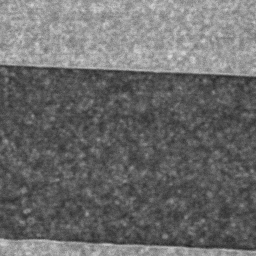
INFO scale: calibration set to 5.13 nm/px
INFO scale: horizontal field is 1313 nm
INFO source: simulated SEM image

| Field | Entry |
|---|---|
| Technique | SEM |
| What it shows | one or a few lines or trenches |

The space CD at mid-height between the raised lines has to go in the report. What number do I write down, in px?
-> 175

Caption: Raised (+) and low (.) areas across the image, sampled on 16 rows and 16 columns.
++++++++++++++++
++++++++++++++++
++++++++++++++++
++++++++++++++++
..........++++++
................
................
................
................
................
................
................
................
................
................
++++++++++++....